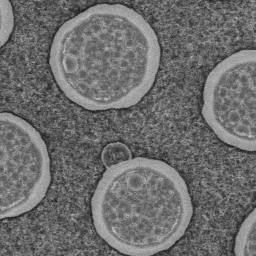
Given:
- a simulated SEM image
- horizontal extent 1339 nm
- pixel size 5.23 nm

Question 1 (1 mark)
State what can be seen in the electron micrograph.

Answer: raised bodies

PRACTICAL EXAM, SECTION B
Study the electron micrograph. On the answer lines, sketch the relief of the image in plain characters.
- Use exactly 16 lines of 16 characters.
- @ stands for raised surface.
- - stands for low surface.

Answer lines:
----------------
----@@@@@-------
----@@@@@@------
---@@@@@@@-----@
----@@@@@-----@@
----@@@@@----@@@
-----@@------@@@
@------------@@@
@@------------@@
@@@-------------
@@@----@@@------
@@@----@@@@-----
@@----@@@@@@----
@-----@@@@@@----
------@@@@@----@
--------@@-----@